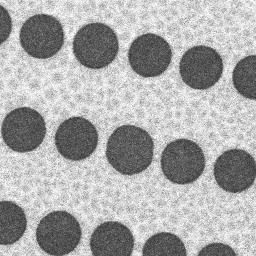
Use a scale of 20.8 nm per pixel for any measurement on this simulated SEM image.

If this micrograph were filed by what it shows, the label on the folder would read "holes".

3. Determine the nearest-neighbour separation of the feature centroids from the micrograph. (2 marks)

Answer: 1130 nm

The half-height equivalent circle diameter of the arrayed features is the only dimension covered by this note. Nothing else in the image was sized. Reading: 947 nm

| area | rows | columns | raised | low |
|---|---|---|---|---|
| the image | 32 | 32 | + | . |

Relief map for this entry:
++++++++++++++++++++++++++++++++
.+++++++++++++++++++++++++++++++
.++....+++++++++++++++++++++++++
.++.....++....++++++++++++++++++
.+......+......++...++++++++++++
+++.....+......+.....+++++++++++
+++....++......+.....++....+++++
++++++++++....++.....++.....++..
+++++++++++..+++.....+......+...
++++++++++++++++++..+++.....+...
+++++++++++++++++++++++....++...
++++++++++++++++++++++++++++++..
++++++++++++++++++++++++++++++++
++..++++++++++++++++++++++++++++
+....+++++++++++++++++++++++++++
......++....++++++++++++++++++++
......+.....++....++++++++++++++
.....++.....+......+++..++++++++
+....++.....+......++....+++++++
++++++++...++......+......+....+
++++++++++++++.....+......+.....
+++++++++++++++...++.....++.....
+++++++++++++++++++++....++.....
++++++++++++++++++++++++++++...+
++++++++++++++++++++++++++++++++
..++++++++++++++++++++++++++++++
...+++..++++++++++++++++++++++++
...++.....++++++++++++++++++++++
...++.....++....++++++++++++++++
...++.....+......++...++++++++++
..+++.....+......+.....+++..++++
++++++...++......+.....++....+++